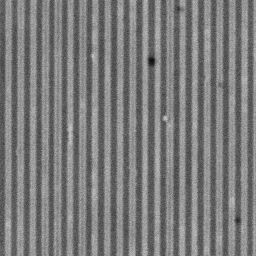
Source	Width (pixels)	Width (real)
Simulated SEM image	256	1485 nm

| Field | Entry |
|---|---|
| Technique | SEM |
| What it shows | parallel lines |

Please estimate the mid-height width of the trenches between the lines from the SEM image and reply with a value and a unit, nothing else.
39.2 nm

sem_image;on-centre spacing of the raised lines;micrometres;0.0721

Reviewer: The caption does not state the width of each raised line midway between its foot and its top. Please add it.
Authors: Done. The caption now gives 29 nanometres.